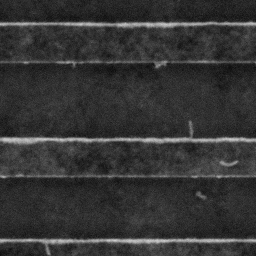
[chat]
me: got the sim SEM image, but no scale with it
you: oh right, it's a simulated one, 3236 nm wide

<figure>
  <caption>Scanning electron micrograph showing lines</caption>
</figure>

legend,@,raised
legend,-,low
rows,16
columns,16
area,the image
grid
----------------
-@@@--------@@@@
@@@@@@@@@@@@@@@@
@@@@@@@@@@@@@@@@
----------------
----------------
----------------
----------------
----------------
@@@@@@@@@@@@@@@@
@@@@@@@@@@@@@@@@
----------------
----------------
----------------
----------------
@@@@@@@@@@@@@@@@